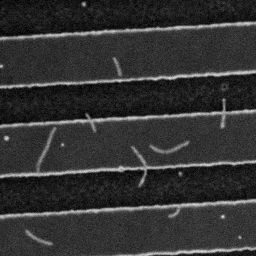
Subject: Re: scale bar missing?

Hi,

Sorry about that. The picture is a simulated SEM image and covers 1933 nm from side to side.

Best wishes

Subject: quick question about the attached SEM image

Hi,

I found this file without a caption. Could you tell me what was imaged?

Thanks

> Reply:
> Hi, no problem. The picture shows lines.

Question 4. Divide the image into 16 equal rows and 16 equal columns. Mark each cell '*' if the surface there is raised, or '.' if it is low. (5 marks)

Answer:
................
..............**
****************
****************
****************
................
................
.....***********
****************
****************
**********......
................
...............*
****************
****************
****************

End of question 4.